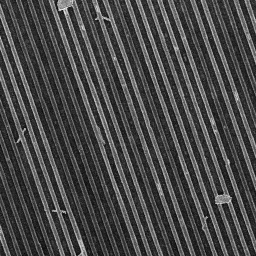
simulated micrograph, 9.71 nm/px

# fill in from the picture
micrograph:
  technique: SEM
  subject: parallel lines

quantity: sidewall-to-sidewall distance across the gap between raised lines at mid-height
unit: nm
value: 59.6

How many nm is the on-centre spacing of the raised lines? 99.9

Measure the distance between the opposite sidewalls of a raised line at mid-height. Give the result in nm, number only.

42.5